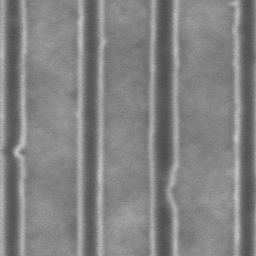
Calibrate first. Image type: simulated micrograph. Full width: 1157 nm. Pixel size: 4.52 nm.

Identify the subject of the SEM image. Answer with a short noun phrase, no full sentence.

one or a few lines or trenches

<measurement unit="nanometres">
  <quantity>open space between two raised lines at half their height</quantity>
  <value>250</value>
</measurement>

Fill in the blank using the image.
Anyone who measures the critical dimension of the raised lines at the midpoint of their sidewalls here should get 0.106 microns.